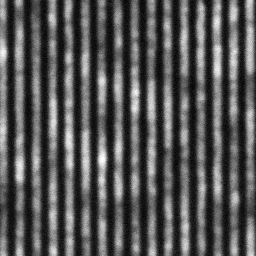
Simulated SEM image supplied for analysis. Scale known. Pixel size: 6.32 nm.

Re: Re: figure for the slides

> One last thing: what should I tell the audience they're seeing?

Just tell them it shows parallel lines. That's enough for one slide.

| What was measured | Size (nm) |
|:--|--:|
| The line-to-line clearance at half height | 73.5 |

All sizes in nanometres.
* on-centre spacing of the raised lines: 104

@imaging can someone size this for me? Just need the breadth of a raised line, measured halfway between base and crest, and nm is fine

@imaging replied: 30.8